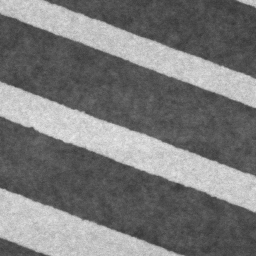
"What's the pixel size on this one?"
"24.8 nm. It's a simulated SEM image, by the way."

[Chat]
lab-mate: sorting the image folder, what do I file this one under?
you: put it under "one or a few lines or trenches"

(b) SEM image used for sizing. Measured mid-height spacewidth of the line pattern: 1630 nm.